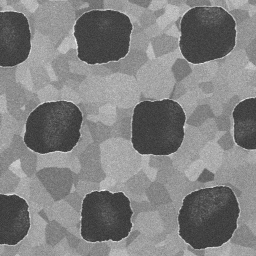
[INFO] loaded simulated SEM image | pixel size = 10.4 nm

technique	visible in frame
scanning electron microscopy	holes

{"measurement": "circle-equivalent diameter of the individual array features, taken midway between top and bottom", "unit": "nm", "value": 595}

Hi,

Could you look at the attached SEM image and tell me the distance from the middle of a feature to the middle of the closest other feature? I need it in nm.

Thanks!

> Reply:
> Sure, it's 1070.